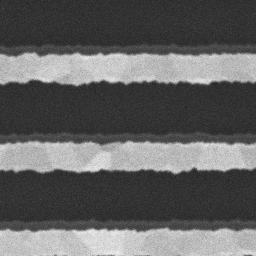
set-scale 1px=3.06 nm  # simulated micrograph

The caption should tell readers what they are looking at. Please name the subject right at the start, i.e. lines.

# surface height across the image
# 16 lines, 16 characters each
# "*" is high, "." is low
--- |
................
................
................
****************
****************
................
................
................
****************
****************
****************
................
................
................
****************
****************